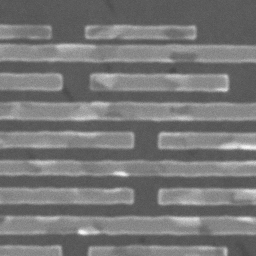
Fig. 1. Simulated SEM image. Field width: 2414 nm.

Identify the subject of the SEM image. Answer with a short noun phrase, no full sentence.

wiring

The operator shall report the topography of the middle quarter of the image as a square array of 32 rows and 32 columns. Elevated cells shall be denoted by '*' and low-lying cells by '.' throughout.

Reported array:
................................
................................
................................
.......*************************
.......*************************
.......*************************
................................
................................
................................
................................
********************************
********************************
********************************
********************************
................................
................................
................................
*****************.......********
*****************.......********
*****************.......********
*****************.......********
................................
................................
................................
***.......**....****.....**.....
********************************
********************************
.***..*****...******************
................................
................................
................................
**********..*****.......********